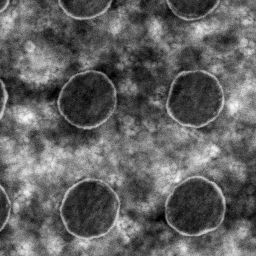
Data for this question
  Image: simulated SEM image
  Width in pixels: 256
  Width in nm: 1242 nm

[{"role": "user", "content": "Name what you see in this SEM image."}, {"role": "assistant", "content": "raised bodies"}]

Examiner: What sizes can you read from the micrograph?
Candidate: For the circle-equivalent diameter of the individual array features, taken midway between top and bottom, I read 57.8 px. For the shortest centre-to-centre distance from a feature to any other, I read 0.517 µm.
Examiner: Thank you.